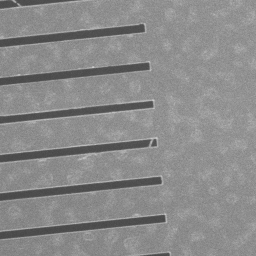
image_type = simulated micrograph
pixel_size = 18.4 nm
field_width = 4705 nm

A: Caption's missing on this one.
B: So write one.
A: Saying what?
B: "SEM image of parallel lines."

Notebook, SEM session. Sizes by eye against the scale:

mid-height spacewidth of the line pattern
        160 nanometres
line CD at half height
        548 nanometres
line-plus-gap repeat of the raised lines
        702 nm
